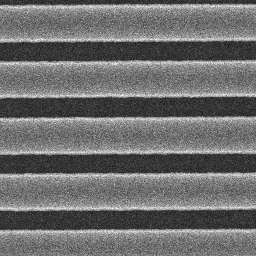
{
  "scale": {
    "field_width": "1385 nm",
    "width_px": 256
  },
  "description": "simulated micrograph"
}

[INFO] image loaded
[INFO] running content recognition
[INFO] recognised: parallel lines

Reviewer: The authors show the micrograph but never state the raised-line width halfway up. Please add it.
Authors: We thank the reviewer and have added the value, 194 nm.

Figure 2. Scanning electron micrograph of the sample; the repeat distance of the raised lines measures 304 nm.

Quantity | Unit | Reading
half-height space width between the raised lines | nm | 111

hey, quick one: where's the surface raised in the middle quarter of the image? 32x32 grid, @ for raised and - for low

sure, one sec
@@@@@@@@@@@@@@@@@@@@@@@@@@@@@@@@
@@@@@@@@@@@@@@@@@@@@@@@@@@@@@@@@
@@@@@@@@@@@@@@@@@@@@@@@@@@@@@@@@
@@@@@@@@@@@@@@@@@@@@@@@@@@@@@@@@
@@@@@@@@@@@@@@@@@@@@@@@@@@@@@@@@
@@@@@@@@@@@@@@@@@@@@@@@@@@@@@@@@
@@@@@@@@@@@@@@@@@@@@@@@@@@@@@@@@
@@@@@@@@@@@@@@@@@@@@@@@@@@@@@@@@
--------------------------------
--------------------------------
--------------------------------
--------------------------------
--------------------------------
-@@@@@-------@----@--------@----
@@@@@@@@@@@@@@@@@@@@@@@@@@@@@@@@
@@@@@@@@@@@@@@@@@@@@@@@@@@@@@@@@
@@@@@@@@@@@@@@@@@@@@@@@@@@@@@@@@
@@@@@@@@@@@@@@@@@@@@@@@@@@@@@@@@
@@@@@@@@@@@@@@@@@@@@@@@@@@@@@@@@
@@@@@@@@@@@@@@@@@@@@@@@@@@@@@@@@
@@@@@@@@@@@@@@@@@@@@@@@@@@@@@@@@
@@@@@@@@@@@@@@@@@@@@@@@@@@@@@@@@
----@---------------------------
--------------------------------
--------------------------------
--------------------------------
--------------------------------
------------------@@@@@-@@@@@@@@
@@@@@@@@@@@@@@@@@@@@@@@@@@@@@@@@
@@@@@@@@@@@@@@@@@@@@@@@@@@@@@@@@
@@@@@@@@@@@@@@@@@@@@@@@@@@@@@@@@
@@@@@@@@@@@@@@@@@@@@@@@@@@@@@@@@